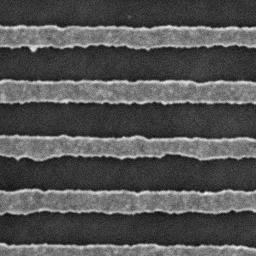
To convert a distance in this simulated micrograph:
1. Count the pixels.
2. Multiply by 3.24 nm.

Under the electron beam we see lines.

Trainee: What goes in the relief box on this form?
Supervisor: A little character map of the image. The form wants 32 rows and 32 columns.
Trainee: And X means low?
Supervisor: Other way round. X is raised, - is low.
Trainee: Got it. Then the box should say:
--------------------------------
--------------------------------
--------------------------------
XXXXXXXXXXXXXXXXX--XXXXXXX--XXXX
XXXXXXXXXXXXXXXXXXXXXXXXXXXXXXXX
XXXXXXXXXXXXXXXXXXXXXXXXXXXXXXXX
--------------------------------
--------------------------------
--------------------------------
--------------------------------
XXXXXXXXXXXXXXXXXXXXXXXXXXXXXXXX
XXXXXXXXXXXXXXXXXXXXXXXXXXXXXXXX
XXXXXXXXXXXXXXXXXXXXXXXXXXXXXXXX
--------------------------------
--------------------------------
--------------------------------
--------------------------------
XXXXXXXXXXXXXXXXXXXXXXXXXXXXXXXX
XXXXXXXXXXXXXXXXXXXXXXXXXXXXXXXX
-XXXXXXX-----XXXXXXX---XXXXXXXXX
--------------------------------
--------------------------------
--------------------------------
--------------------------------
XXXXXXXXXXXXXXXXXXXXXXXXXXXXXXXX
XXXXXXXXXXXXXXXXXXXXXXXXXXXXXXXX
XXXX-----X---XXXXX---XX--XXX----
--------------------------------
--------------------------------
--------------------------------
--------------------------------
XXXXXXXXXXXXXXXXXXXXXXXXXXXXXXXX